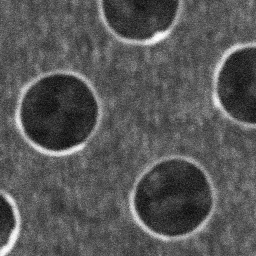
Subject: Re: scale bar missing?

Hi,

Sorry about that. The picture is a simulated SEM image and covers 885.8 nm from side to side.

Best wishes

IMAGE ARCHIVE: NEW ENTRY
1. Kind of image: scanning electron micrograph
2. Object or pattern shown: holes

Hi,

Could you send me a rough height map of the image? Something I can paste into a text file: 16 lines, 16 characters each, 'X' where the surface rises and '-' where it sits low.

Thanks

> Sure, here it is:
XXXXXX-----XXXXX
XXXXXXX----XXXXX
XXXXXXXX-XXXXXXX
XXXXXXXXXXXXXX--
XXXXXXXXXXXXXX--
XX----XXXXXXXX--
X-----XXXXXXXX--
X-----XXXXXXXXX-
XX----XXXXXXXXXX
XXXXXXXXXXXXXXXX
XXXXXXXXX---XXXX
XXXXXXXXX----XXX
XXXXXXXX-----XXX
-XXXXXXXX----XXX
-XXXXXXXXX--XXXX
XXXXXXXXXXXXXXXX